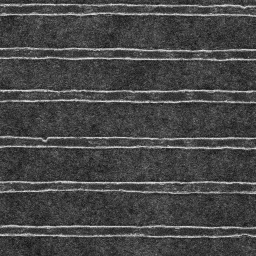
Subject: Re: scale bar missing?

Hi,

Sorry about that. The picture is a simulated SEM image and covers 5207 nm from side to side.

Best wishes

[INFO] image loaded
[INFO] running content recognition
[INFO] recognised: parallel lines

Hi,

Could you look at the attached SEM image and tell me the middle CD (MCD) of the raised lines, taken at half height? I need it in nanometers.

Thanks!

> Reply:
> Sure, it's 203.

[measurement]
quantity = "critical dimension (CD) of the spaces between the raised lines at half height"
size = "707 nm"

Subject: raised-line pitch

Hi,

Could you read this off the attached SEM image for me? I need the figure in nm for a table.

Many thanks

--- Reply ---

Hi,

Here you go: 901